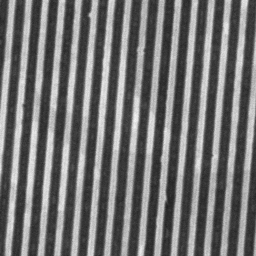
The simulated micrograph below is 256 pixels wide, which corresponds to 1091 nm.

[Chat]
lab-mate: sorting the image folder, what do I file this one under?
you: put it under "parallel lines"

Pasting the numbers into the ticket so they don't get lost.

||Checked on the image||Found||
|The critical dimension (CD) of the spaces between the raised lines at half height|9.6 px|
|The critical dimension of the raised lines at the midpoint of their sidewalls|28.7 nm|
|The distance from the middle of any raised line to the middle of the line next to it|0.0705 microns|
